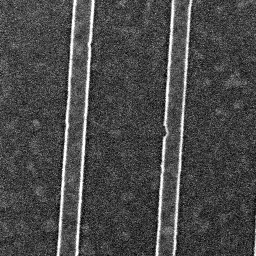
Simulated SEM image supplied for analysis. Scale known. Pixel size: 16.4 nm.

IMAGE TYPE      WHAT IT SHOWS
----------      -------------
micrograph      one or a few lines or trenches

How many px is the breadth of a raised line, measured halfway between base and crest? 18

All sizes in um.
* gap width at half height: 1.31